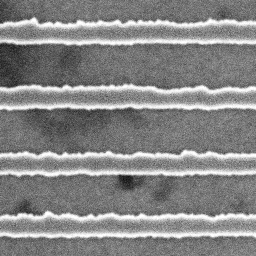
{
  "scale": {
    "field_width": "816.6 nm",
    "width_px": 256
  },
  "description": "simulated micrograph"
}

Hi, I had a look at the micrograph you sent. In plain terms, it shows lines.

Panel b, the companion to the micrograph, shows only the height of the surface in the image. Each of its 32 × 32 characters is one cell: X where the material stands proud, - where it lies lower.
--------------------------------
--------------------------------
--------------------------------
XXXXXXXXXXXXXXXXXXXXXXXXXXXXXXXX
XXXXXXXXXXXXXXXXXXXXXXXXXXXXXXXX
--XX----XXX---XX----------------
--------------------------------
--------------------------------
--------------------------------
--------------------------------
--------------------------------
XXXXXXXXXXXXXXXXXXXXXXXXXXXXXXXX
XXXXXXXXXXXXXXXXXXXXXXXXXXXXXXXX
XXXX--X---XX-X---------X-XXX----
--------------------------------
--------------------------------
--------------------------------
--------------------------------
--------------------------------
XXXXXXXXXXXXXXXXXXXXXXXXXXXXXXXX
XXXXXXXXXXXXXXXXXXXXXXXXXXXXXXXX
XXXXXXXXXXXXXXXXXXXXXXXXXXXXXXXX
--------------------------------
--------------------------------
--------------------------------
--------------------------------
--------------------------------
XXXXXXXXXXXXXXXXXXXXXXXXXXXXXXXX
XXXXXXXXXXXXXXXXXXXXXXXXXXXXXXXX
-XXXXXXXXXXXX-XXX---XXX---------
--------------------------------
--------------------------------